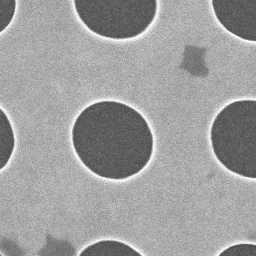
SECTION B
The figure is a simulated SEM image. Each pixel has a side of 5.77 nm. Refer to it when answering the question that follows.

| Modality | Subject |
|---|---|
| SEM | holes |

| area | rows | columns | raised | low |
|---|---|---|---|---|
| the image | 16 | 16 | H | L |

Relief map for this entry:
LHHHHLLLLLHHHLLL
LHHHHLLLLHHHHHLL
HHHHHHHHHHHHHHHH
HHHHHHHHHHHHHHHH
HHHHHHHHHHHHHHHH
HHHHHHHHHHHHHHHH
HHHHHHLLHHHHHHLL
LHHHHLLLLHHHHLLL
LHHHHLLLLHHHHLLL
LHHHHLLLLHHHHLLL
HHHHHHLLLHHHHHLL
HHHHHHHHHHHHHHHH
HHHHHHHHHHHHHHHH
HHHHHHHHHHHHHHHH
HHHHHHHHHHHHHHHH
HHHHHLLLHHHHHHLL